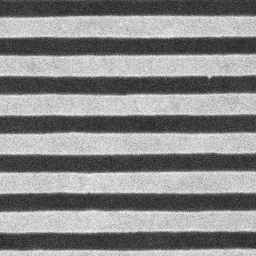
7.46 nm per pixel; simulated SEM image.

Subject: parallel lines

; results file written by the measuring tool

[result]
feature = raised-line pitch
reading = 291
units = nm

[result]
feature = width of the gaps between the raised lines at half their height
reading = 0.124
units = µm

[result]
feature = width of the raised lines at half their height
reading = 168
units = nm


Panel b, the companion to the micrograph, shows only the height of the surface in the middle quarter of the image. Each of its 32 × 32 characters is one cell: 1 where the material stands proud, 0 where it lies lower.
11111111111111111111111111111111
11111111111111111111111111111111
11111111111111111111111111111111
00000000000000000000000000000000
00000000000000000000000000000000
00000000000000000000000000000000
00000000000000000000000000000000
11111000000000000000000000000000
11111111111111111111111111111111
11111111111111111111111111111111
11111111111111111111111111111111
11111111111111111111111111111111
11111111111111111111111111111111
00000000000000000000000000000000
00000000000000000000000000000000
00000000000000000000000000000000
00000000000000000000000000000000
11111111111111111111111111111111
11111111111111111111111111111111
11111111111111111111111111111111
11111111111111111111111111111111
11111111111111111111111111111111
11111111111111111111111111100000
00000000000000000000000000000000
00000000000000000000000000000000
00000000000000000000000000000000
00000000000000000000000000000000
11111111111111111111111111111111
11111111111111111111111111111111
11111111111111111111111111111111
11111111111111111111111111111111
11111111111111111111111111111111